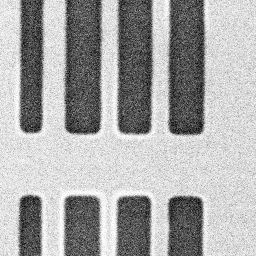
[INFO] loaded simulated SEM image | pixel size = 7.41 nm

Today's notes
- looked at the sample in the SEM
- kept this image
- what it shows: groups of lines, slits or small figures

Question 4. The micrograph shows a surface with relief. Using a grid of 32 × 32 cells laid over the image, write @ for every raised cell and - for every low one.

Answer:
@@----@@-----@@----@@-----@@@@@@
@@----@@-----@@----@@-----@@@@@@
@@----@@-----@@----@@-----@@@@@@
@@----@@-----@@----@@-----@@@@@@
@@----@@-----@@----@@-----@@@@@@
@@----@@-----@@----@@-----@@@@@@
@@----@@-----@@----@@-----@@@@@@
@@----@@-----@@----@@-----@@@@@@
@@----@@-----@@----@@-----@@@@@@
@@----@@-----@@----@@-----@@@@@@
@@----@@-----@-----@@-----@@@@@@
@@----@@-----@-----@@-----@@@@@@
@@----@@-----@-----@@-----@@@@@@
@@----@@-----@-----@@-----@@@@@@
@@----@@-----@-----@@-----@@@@@@
@@----@@-----@-----@@-----@@@@@@
@@@--@@@-----@@----@@----@@@@@@@
@@@@@@@@@@@@@@@@@@@@@@@@@@@@@@@@
@@@@@@@@@@@@@@@@@@@@@@@@@@@@@@@@
@@@@@@@@@@@@@@@@@@@@@@@@@@@@@@@@
@@@@@@@@@@@@@@@@@@@@@@@@@@@@@@@@
@@@@@@@@@@@@@@@@@@@@@@@@@@@@@@@@
@@@@@@@@@@@@@@@@@@@@@@@@@@@@@@@@
@@@@@@@@@@@@@@@@@@@@@@@@@@@@@@@@
@@@--@@@-----@@----@@@---@@@@@@@
@@---@@@-----@-----@@-----@@@@@@
@@----@@-----@-----@@-----@@@@@@
@@----@@-----@-----@@-----@@@@@@
@@----@@-----@-----@@-----@@@@@@
@@----@@-----@-----@@-----@@@@@@
@@----@@-----@-----@@-----@@@@@@
@@----@@-----@-----@@-----@@@@@@